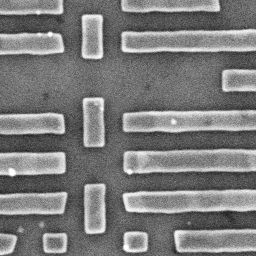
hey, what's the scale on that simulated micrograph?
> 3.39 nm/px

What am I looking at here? wiring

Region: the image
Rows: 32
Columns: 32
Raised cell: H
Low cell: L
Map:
HHHHHHHHLLLLLLLHHHHHHHHHHHHLLLLL
HHHHHHHHLLLLLLLLLHLLLLLLLLLLLLLL
LLLLLLLLLLHHHLLLLLLLLLLLLLLLLLLL
LLLLLLLLLLHHHLLLLLLLLLLLLLLLLLLL
HHHHHHHLLLHHHLLHHHHHHHHHHHHHHHHH
HHHHHHHHLLHHHLLHHHHHHHHHHHHHHHHH
HHHHHHHHLLHHHLLLLLLLLLLLLLLLLLLL
LLLLLLLLLLLLLLLLLLLLLLLLLLLLLLLL
LLLLLLLLLLLLLLLLLLLLLLLLLLLLLLLL
LLLLLLLLLLLLLLLLLLLLLLLLLLLLHHHH
LLLLLLLLLLLLLLLLLLLLLLLLLLLLHHHH
LLLLLLLLLLLLLLLLLLLLLLLLLLLLLLLL
LLLLLLLLLLLHHLLLLLLLLLLLLLLLLLLL
LLLLLLLLLLHHHLLLLLLLLLLLLLLLLLLL
HHHHHHHHLLHHHLLLHHHHHHHHHHHHHHHH
HHHHHHHHLLLHHLLHHHHHHHHHHHHHHHHH
HHHHHHHHLLLHHLLLLLLLLLLLLLLLLLLL
LLLLLLLLLLLHHLLLLLLLLLLLLLLLLLLL
LLLLLLLLLLLLLLLLLLLLLLLLLLLLLLLL
HHHHHHHHLLLLLLLLHHHHHHHHHHHHHHHH
HHHHHHHHLLLLLLLLHHHHHHHHHHHHHHHH
HHHHHHHHLLLLLLLLHHHLLLLLLLLLLLLL
LLLLLLLLLLLLLLLLLLLLLLLLLLLLLLLL
LLLLLLLLLLLHHLLLLLLLLLLLLLLLLLLL
HHHHHHHHLLLHHLLLHHHHHHHHHHHHHHHH
HHHHHHHHLLLHHLLLHHHHHHHHHHHHHHHH
HHHHHHHHLLLHHLLLLLLLHHLLLLLLLLLL
LLLLLLLLLLLHHLLLLLLLLLLLLLLLLLLL
LLLLLLLLLLLHHLLLLLLLLLLLLLLLLLLL
HHLLLHHHLLLLLLLLHHLLLLHHHHHHHHHH
HHLLLHHHLLLLLLLLHHLLLLHHHHHHHHHH
HLLLLLHHLLLLLLLLHLLLLLLLLLLHLLLL